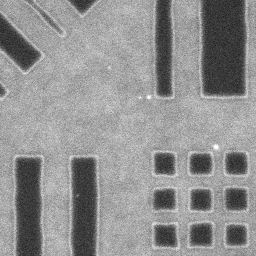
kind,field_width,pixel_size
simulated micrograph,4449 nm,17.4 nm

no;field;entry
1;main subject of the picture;groups of lines, slits or small figures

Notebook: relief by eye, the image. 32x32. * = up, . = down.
...**....***.......***...******.
.....*....*........***...******.
*....**............***...******.
**....**...........***...******.
***................***...******.
****...............***...******.
*****..............***...******.
.****..............***...******.
..**...............***...******.
...................***...******.
...................***...******.
*..................***...******.
................................
................................
................................
................................
................................
................................
................................
..***.....**.......***..***.***.
..***....***.......***..***.***.
..***....***.......***..***.***.
..***....***....................
..***....***........**......***.
..***....***.......***..***.***.
..***....***.......***..***.***.
..***....***....................
..***....***....................
..***....***.......***..***.***.
..***....***.......***..***.***.
..***....***.......***..***.***.
..***....***....................